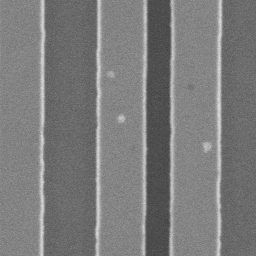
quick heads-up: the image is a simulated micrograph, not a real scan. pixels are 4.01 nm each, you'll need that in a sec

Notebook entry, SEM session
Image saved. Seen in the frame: lines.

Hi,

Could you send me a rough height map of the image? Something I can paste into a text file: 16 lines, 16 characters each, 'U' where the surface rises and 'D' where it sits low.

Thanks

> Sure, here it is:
UUUDDDUUUDDUUUDD
UUUDDDUUUDDUUUDD
UUUDDDUUUDDUUUDD
UUUDDDUUUDDUUUDD
UUUDDDUUUDDUUUDD
UUUDDDUUUDDUUUDD
UUUDDDUUUDDUUUDD
UUUDDDUUUDDUUUDD
UUUDDDUUUDDUUUDD
UUUDDDUUUDDUUUDD
UUUDDDUUUDDUUUDD
UUUDDDUUUDDUUUDD
UUUDDDUUUDDUUUDD
UUUDDDUUUDDUUUDD
UUUDDDUUUDDUUUDD
UUUDDDUUUDDUUUDD